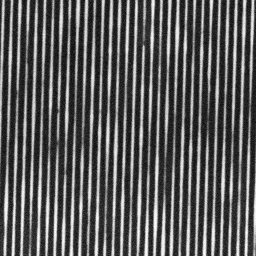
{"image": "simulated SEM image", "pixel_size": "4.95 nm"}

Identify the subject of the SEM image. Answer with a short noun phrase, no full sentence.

parallel lines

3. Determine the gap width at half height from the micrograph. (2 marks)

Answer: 30.3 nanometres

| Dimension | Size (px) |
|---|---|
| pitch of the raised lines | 8.32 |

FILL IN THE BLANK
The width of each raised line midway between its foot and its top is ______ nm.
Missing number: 12.4